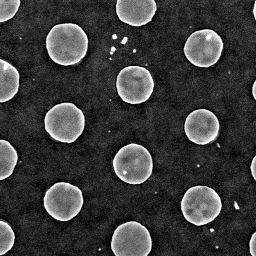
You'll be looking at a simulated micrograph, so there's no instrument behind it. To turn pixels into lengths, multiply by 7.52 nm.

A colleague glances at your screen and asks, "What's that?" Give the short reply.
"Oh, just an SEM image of a regular array of raised bodies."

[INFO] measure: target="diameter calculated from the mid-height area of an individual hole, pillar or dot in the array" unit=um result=0.283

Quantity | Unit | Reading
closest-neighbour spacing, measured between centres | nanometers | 252